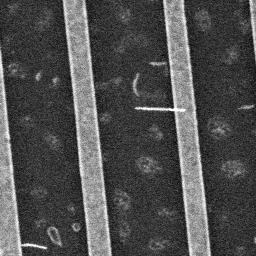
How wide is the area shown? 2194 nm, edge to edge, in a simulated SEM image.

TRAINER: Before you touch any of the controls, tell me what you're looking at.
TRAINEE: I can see one or a few lines or trenches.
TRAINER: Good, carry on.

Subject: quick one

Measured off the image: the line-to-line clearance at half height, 0.598 um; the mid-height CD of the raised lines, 173 nanometers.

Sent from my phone